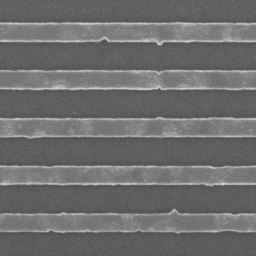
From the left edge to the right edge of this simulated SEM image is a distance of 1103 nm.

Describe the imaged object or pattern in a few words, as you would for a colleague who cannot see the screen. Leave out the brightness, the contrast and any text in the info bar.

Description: parallel lines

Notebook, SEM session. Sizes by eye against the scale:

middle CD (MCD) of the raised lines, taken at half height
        78.7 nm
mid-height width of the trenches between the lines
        0.127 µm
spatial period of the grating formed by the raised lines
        205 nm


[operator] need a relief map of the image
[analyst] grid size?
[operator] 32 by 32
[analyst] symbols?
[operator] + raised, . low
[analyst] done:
................................
................................
................................
++++++++++++++++++++++++++++++++
++++++++++++++++++++++++++++++++
................................
................................
................................
................................
++++++++++++++++++++++++++++++++
++++++++++++++++++++++++++++++++
................................
................................
................................
................................
++++++++++++++++++++++++++++++++
++++++++++++++++++++++++++++++++
................................
................................
................................
................................
++++++++++++++++++++++++++++++++
++++++++++++++++++++++++++++++++
................................
................................
................................
.....................+..........
++++++++++++++++++++++++++++++++
++++++++++++++++++++++++++++++++
................................
................................
................................